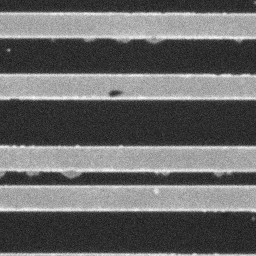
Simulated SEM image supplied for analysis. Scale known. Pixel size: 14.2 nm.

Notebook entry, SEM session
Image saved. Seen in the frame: lines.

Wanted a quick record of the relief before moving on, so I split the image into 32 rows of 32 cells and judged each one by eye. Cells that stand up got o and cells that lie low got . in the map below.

................................
................................
oooooooooooooooooooooooooooooooo
oooooooooooooooooooooooooooooooo
oooooooooooooooooooooooooooooooo
................................
................................
................................
................................
oooooooooooooooooooooooooooooooo
oooooooooooooooooooooooooooooooo
oooooooooooooooooooooooooooooooo
................................
................................
................................
................................
................................
................................
oooooooooooooooooooooooooooooooo
oooooooooooooooooooooooooooooooo
oooooooooooooooooooooooooooooooo
........o.......................
................................
oooooooooooooooooooooooooooooooo
oooooooooooooooooooooooooooooooo
oooooooooooooooooooooooooooooooo
................................
................................
................................
................................
................................
................................